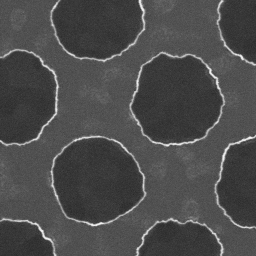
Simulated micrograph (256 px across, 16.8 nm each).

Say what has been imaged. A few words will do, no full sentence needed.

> raised bodies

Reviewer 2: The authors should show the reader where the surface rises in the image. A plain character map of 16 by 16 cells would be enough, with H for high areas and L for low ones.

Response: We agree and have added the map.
LLLHHHHHHLLLLLHH
LLLHHHHHHLLLLLHH
LLLLHHHHLLLLLLHH
HHLLLHHLLLHHLLLH
HHHLLLLLLHHHHLLL
HHHHLLLLLHHHHHLL
HHHHLLLLHHHHHHLL
HHHLLLLLLHHHHHLL
HHLLLLLLLHHHHLLL
LLLLHHHHLLLLLLHH
LLLHHHHHHLLLLLHH
LLLHHHHHHLLLLLHH
LLLLHHHHHLLLLLHH
LLLLHHHHLLLLLLHH
HHHLLLLLLHHHHLLL
HHHLLLLLLHHHHHLL